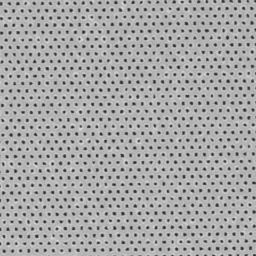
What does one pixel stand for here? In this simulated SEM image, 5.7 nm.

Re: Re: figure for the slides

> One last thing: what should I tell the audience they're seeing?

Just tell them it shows a regular array of holes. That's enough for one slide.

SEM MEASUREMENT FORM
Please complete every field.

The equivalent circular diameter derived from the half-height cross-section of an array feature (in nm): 19.3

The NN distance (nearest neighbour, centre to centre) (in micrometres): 0.0439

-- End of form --